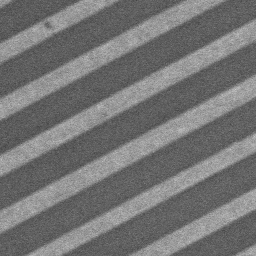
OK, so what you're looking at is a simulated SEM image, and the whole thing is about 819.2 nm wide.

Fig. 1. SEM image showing parallel lines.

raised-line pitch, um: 0.159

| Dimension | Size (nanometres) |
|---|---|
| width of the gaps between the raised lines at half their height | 102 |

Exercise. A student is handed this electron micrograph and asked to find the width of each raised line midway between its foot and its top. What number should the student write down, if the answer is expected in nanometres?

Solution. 58.8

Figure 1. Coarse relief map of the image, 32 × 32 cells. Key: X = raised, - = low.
X--------XXXXX--------XXXXX-----
-------XXXXX---------XXXX-------
------XXXX---------XXXX---------
----XXXX---------XXXXX--------XX
--XXXX---------XXXXX--------XXXX
XXXXX--------XXXXX--------XXXXX-
XXX--------XXXXX--------XXXXX---
X--------XXXXX--------XXXXX-----
-------XXXXX---------XXXX-------
------XXXX---------XXXXX--------
----XXXX---------XXXXX--------XX
--XXXX---------XXXXX--------XXXX
XXXXX--------XXXXX--------XXXXX-
XXX--------XXXXX--------XXXXX---
X--------XXXXX--------XXXXXX----
-------XXXXX---------XXXX-------
------XXXX---------XXXXX--------
----XXXXX--------XXXXX--------XX
--XXXXX--------XXXXX---------XXX
XXXXX--------XXXXX---------XXXX-
XXX--------XXXXX---------XXXX---
X--------XXXXX---------XXXX-----
-------XXXXX---------XXXX-------
------XXXX---------XXXX---------
----XXXXX--------XXXX---------XX
--XXXXX---------XXXX--------XXXX
XXXXX---------XXXX---------XXXX-
XXX---------XXXX---------XXXX---
X---------XXXX---------XXXXX----
--------XXXX---------XXXXX------
------XXXX---------XXXXX--------
----XXXX---------XXXXX--------XX